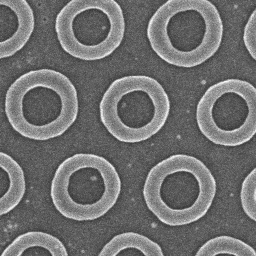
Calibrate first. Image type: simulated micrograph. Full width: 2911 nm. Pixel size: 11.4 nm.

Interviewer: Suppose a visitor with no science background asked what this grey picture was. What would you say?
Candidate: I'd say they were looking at ring-shaped raised bodies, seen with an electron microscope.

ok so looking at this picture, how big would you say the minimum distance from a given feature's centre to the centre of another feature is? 1060 nanometers